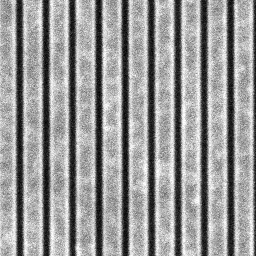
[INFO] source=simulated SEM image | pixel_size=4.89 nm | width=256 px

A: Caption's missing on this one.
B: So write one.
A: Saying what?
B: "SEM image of parallel lines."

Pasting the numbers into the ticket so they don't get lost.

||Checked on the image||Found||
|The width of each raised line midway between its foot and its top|0.0917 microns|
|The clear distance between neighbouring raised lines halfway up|37.9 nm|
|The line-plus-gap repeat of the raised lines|129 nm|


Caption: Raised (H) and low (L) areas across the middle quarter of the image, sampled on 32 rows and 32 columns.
HLLHHHHHLLHHHHLLHHHHHLLHHHHLLLHH
HLLHHHHHLLHHHHLLHHHHHLLHHHHLLLHH
HLLHHHHHLLHHHHLLHHHHHLLHHHHLLLHH
HLLHHHHHLLHHHHLLHHHHHLLHHHHLLLHH
HLLHHHHHLLHHHHLLHHHHHLLHHHHLLLHH
HLLHHHHHLLHHHHLLHHHHHLLHHHHLLLHH
HLLHHHHHLLHHHHLLHHHHHLLHHHHLLLHH
HLLHHHHHLLHHHHLLHHHHHLLHHHHLLLHH
HLLHHHHHLLHHHHLLHHHHHLLHHHHLLLHH
HLLHHHHHLLHHHHLLHHHHHLLHHHHLLLHH
HLLHHHHHLLHHHHLLHHHHHLLHHHHLLLHH
HLLHHHHHLLHHHHLLHHHHHLLHHHHLLLHH
HLLHHHHHLLHHHHLLHHHHHLLHHHHLLLHH
HLLHHHHHLLHHHHLLHHHHHLLHHHHLLLHH
HLLHHHHHLLHHHHLLHHHHHLLHHHHLLLHH
HLLHHHHHLLHHHHLLHHHHHLLHHHHLLLHH
HLLHHHHHLLHHHHLLHHHHHLLHHHHLLLHH
HLLHHHHHLLHHHHLLHHHHHLLHHHHLLLHH
HLLHHHHHLLHHHHLLHHHHHLLHHHHLLLHH
HLLHHHHHLLHHHHLLHHHHHLLHHHHLLLHH
HLLHHHHHLLHHHHLLHHHHHLLHHHHLLLHH
HLLHHHHHLLHHHHLLHHHHHLLHHHHLLLHH
HLLHHHHHLLHHHHLLHHHHHLLHHHHLLLHH
HLLHHHHHLLHHHHLLHHHHHLLHHHHLLLHH
HLLHHHHHLLHHHHLLHHHHHLLHHHHLLLHH
HLLHHHHHLLHHHHLLHHHHHLLHHHHLLLHH
HLLHHHHHLLHHHHLLHHHHHLLHHHHLLLHH
HLLHHHHHLLHHHHLLHHHHHLLHHHHLLLHH
HLLHHHHHLLHHHHLLHHHHHLLHHHHLLLHH
HLLHHHHHLLHHHHLLHHHHHLLHHHHLLLHH
HLLHHHHHLLHHHHLLHHHHHLLHHHHLLLHH
HLLHHHHHLLHHHHLLHHHHHLLHHHHLLLHH